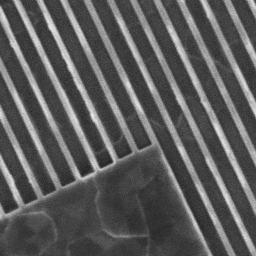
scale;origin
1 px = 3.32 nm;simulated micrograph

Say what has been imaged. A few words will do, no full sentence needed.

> parallel lines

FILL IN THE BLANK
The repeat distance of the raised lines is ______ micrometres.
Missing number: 0.0703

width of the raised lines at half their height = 0.0187 um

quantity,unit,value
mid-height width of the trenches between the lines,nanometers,50.2